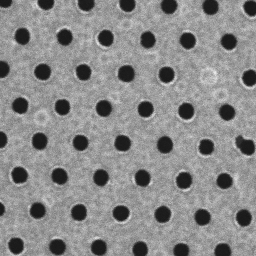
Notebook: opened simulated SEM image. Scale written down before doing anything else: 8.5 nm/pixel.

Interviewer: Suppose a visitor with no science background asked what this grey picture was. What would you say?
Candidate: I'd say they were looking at a regular array of holes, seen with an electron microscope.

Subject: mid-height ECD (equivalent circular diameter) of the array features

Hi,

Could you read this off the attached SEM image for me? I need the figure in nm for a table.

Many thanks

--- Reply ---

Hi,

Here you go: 146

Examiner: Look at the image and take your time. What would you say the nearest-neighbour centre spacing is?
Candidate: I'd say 339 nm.